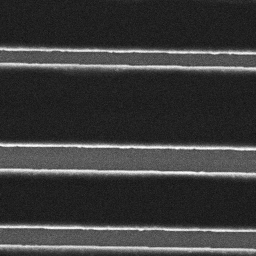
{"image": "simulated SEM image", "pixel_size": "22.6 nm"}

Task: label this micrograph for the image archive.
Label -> lines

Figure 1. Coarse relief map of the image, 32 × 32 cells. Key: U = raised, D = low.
UUUUUUUUUUUUUUUUUUUUUUUUUUUUUUUU
UUUUUUUUUUUUUUUUUUUUUUUUUUUUUUUU
UUUUUUUUUUUUUUUUUUUUUUUUUUUUUUUU
UUUUUUUUUUUUUUUUUUUUUUUUUUUUUUUU
UUUUUUUUUUUUUUUUUUUUUUUUUUUUUUUU
UUUUUUUUUUUUUUUUUUUUUUUUUUUUUUUU
DDDDDDDDDDDDDDDDDDDDDUUUUUUUUUUU
DDDDDDDDDDDDDDDDDDDDDDDDDDDDDDDD
UUUUUUUUUUUUUUUUUUUUUUUUUDDDDDDD
UUUUUUUUUUUUUUUUUUUUUUUUUUUUUUUU
UUUUUUUUUUUUUUUUUUUUUUUUUUUUUUUU
UUUUUUUUUUUUUUUUUUUUUUUUUUUUUUUU
UUUUUUUUUUUUUUUUUUUUUUUUUUUUUUUU
UUUUUUUUUUUUUUUUUUUUUUUUUUUUUUUU
UUUUUUUUUUUUUUUUUUUUUUUUUUUUUUUU
UUUUUUUUUUUUUUUUUUUUUUUUUUUUUUUU
UUUUUUUUUUUUUUUUUUUUUUUUUUUUUUUU
UUUUUUUUUUUUUUUUUUUUUUUUUUUUUUUU
DDDDDDDDDDDDDDDDDDDDDDDDDUUUUUUU
DDDDDDDDDDDDDDDDDDDDDDDDDDDDDDDD
DDDDDDDDDDDDDDDDDDDDDDDDDDDDDDDD
UUUUUUUUUUUUDDDDDDDDDDDDDDDDDDDD
UUUUUUUUUUUUUUUUUUUUUUUUUUUUUUUU
UUUUUUUUUUUUUUUUUUUUUUUUUUUUUUUU
UUUUUUUUUUUUUUUUUUUUUUUUUUUUUUUU
UUUUUUUUUUUUUUUUUUUUUUUUUUUUUUUU
UUUUUUUUUUUUUUUUUUUUUUUUUUUUUUUU
UUUUUUUUUUUUUUUUUUUUUUUUUUUUUUUU
DDDDDDDDDUUUUUUUUUUUUUUUUUUUUUUU
DDDDDDDDDDDDDDDDDDDDDDDDDDDDDDDD
DDDDDDDDDDDDDDDDDDDDDDDDDDDDDDDD
UUUUUUUUUUUUUUUUUUUUUUUUUUUUUUUU